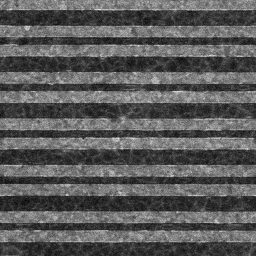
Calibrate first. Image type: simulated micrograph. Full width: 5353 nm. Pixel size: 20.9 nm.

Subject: parallel lines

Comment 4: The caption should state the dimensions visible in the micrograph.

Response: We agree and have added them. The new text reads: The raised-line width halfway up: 227 nm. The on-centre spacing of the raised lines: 0.476 um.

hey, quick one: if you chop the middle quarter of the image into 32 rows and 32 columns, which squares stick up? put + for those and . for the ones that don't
................+...............
................................
++++++++++++++++++++++++++++++++
++++++++++++++++++++++++++++++++
++++++++++++++++++++++++++++++++
................+...............
................................
++++++++++++++++++++++++++++++++
++++++++++++++++++++++++++++++++
++++++++++++++++++++++++++++++++
................................
.....++.........................
.....++.........................
................................
++++++++++++++++++++++++++++++++
++++++++++++++++++++++++++++++++
................................
..............................+.
................................
++++++++++++++++++++++++++++++++
++++++++++++++++++++++++++++++++
................................
................................
................................
................................
++++++++++++++++++++++++++++++++
++++++++++++++++++++++++++++++++
++++++++++++++++++++++++++++++++
................................
................................
++++++++++++++++++++++++++++++++
++++++++++++++++++++++++++++++++